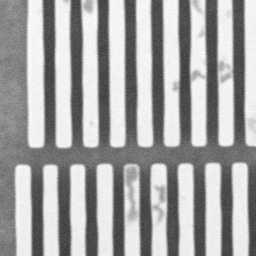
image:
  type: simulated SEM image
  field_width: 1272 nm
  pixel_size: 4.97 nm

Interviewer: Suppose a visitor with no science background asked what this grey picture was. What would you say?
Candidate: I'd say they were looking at groups of lines, slits or small figures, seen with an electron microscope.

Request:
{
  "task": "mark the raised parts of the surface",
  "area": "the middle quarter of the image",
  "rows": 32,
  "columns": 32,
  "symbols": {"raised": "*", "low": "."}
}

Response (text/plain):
*....***....***...****...****...
**...***....***...****...****...
**...***....***...****...****...
**...***....***...****...****...
**...***....***...****...****...
**...***....***...****...****...
**...***....***....***...****...
**...***....***....***...****...
*....***....***....***...****...
*....***....***....***...****...
*....***....***...****...****...
**...***....***...****...****...
**...***....***...****...****...
**...***....***...****...****...
**...***....***...****...****...
**...***....***...****...****...
**...***....***...****...****...
**...***....***...****...****...
**...***....***....***...****...
**...***....***....***...****...
*....***....***....***....**....
................................
................................
................................
................................
..***....***...***....***....***
..***...****...****...***....***
..***...****...****...***....***
..***...****...****...***....***
..***...****...****...***....***
..***...****...****...***....***
..***...****...****...***....***